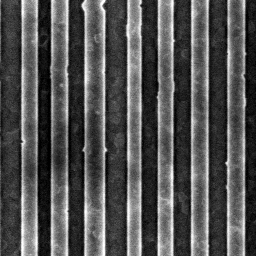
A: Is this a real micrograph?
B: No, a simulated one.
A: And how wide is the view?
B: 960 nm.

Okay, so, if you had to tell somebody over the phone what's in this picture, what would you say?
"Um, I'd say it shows parallel lines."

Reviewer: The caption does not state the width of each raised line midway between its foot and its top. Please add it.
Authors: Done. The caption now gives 59 nm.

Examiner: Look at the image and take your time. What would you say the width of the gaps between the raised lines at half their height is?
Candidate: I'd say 69.3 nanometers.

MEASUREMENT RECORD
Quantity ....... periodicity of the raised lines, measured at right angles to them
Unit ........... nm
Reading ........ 129